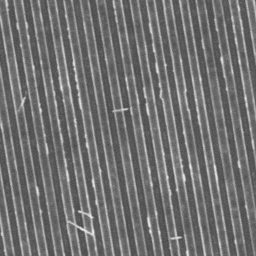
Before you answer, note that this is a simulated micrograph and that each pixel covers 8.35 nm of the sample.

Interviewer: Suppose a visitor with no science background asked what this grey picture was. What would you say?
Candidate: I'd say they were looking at parallel lines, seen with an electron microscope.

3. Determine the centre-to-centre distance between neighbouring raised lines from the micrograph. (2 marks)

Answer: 0.137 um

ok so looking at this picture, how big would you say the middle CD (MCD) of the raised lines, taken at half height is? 9.01 pixels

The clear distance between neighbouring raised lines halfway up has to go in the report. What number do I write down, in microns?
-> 0.0598